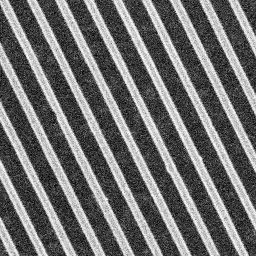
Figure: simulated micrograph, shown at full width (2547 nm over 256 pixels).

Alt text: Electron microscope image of parallel lines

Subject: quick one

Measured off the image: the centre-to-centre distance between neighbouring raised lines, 25.7 px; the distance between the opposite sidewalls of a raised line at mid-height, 0.0736 µm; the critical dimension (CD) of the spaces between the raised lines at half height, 183 nanometers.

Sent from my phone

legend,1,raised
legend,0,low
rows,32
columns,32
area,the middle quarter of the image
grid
10000011000001100000010000001100
11000001100000110000011000001100
11000001100000110000011000000110
11000000110000011000001100000110
01100000110000011000001100000011
01100000011000001100000110000011
00110000011000001100000110000001
00110000001100000110000011000001
00011000001100000110000011000000
00011000000110000011000001100000
00001100000110000011000001100000
00001100000011000001100000110000
00000110000011000001100000110000
00000110000001100000110000011000
10000011000001100000110000011000
10000011000000110000011000001100
11000001100000110000011000001100
11000001100000011000001100000110
01100000110000011000001100000110
01100000110000001000000110000011
00110000011000001100000110000011
00110000011000000100000011000001
00011000001100000110000011000001
00011000001100000110000001100000
00001100000110000011000001100000
00001100000111000011000000110000
00000110000011000001100000110000
00000110000011000001100000011000
00000011000001100000110000011000
10000011000001100000110000001100
11000001100000110000011000001100
11000001100000110000011000000110